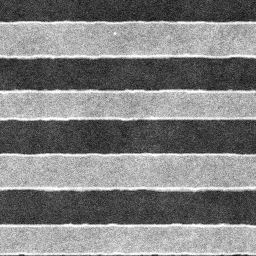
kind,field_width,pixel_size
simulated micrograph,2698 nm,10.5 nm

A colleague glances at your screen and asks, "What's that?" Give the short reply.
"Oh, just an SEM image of lines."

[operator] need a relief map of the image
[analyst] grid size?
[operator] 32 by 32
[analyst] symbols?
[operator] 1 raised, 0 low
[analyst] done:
00000000000000000000000000000000
00000000000000000000000000000000
00000000000000000000000000000000
11111111111111111111111111111111
11111111111111111111111111111111
11111111111111111111111111111111
11111111111111111111111111111111
00000000000000000000000000000000
00000000000000000000000000000000
00000000000000000000000000000000
00000000000000000000000000000000
11111111111111111111111111111111
11111111111111111111111111111111
11111111111111111111111111111111
11111111111111111111111111111111
00000000000000000000000000000000
00000000000000000000000000000000
00000000000000000000000000000000
00000000000000000000000000000000
11111111111111111111111111111111
11111111111111111111111111111111
11111111111111111111111111111111
11111111111111111111111111111111
11111111111111111111111111111111
00000000000000000000000000000000
00000000000000000000000000000000
00000000000000000000000000000000
00000000000000000000000000000000
11111111111111111111111111111111
11111111111111111111111111111111
11111111111111111111111111111111
11111111111111111111111111111111